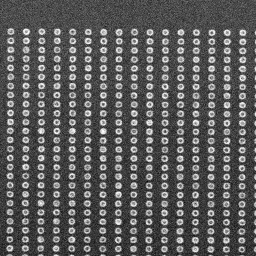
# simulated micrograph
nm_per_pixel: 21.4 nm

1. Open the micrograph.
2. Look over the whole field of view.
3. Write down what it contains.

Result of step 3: a regular array of raised bodies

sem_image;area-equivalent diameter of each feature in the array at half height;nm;113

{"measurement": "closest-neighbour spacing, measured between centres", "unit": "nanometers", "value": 190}